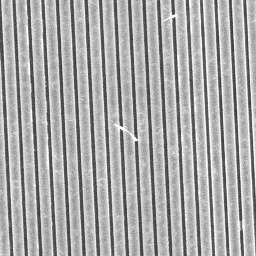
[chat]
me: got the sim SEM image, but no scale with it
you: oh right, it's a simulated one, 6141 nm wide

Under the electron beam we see parallel lines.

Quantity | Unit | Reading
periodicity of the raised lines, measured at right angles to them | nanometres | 345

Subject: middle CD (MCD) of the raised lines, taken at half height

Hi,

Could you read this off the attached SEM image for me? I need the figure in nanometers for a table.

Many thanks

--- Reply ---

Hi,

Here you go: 255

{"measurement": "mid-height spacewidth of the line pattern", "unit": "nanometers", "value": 92.8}